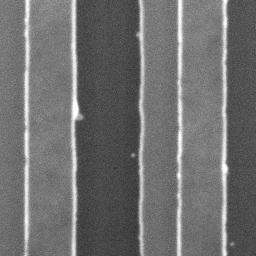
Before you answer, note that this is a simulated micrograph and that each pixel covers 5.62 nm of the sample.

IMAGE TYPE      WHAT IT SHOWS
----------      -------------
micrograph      lines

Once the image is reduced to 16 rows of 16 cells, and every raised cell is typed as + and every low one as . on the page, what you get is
+++++....+++++..
+++++....+++++..
+++++....+++++..
+++++....+++++..
+++++....+++++..
+++++....+++++..
+++++....+++++..
+++++....+++++..
+++++....+++++..
+++++....+++++..
+++++....+++++..
+++++....+++++..
+++++....+++++..
+++++....+++++..
+++++....+++++..
+++++....+++++..